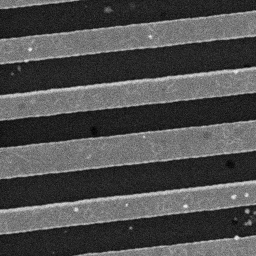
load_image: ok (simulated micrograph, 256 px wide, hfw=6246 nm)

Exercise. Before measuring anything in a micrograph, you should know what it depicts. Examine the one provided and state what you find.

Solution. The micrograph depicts lines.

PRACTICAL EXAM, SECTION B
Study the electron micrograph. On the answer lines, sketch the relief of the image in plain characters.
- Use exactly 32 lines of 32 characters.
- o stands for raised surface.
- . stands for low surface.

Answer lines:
ooooo...........................
...............................o
......................oooooooooo
.............ooooooooooooooooooo
....oooooooooooooooooooooooooooo
ooooooooooooooooooooooo.........
ooooooooooooo...................
ooooo...........................
...............................o
......................oooooooooo
.............ooooooooooooooooooo
....oooooooooooooooooooooooooooo
ooooooooooooooooooooooo.........
oooooooooooooo..................
ooooo...........................
...........................ooooo
..................oooooooooooooo
..........oooooooooooooooooooooo
.ooooooooooooooooooooooooooooooo
oooooooooooooooooooooooooo......
ooooooooooooooooo...............
oooooooo........................
................................
.........................ooooooo
................oooooooooooooooo
.......ooooooooooooooooooooooooo
oooooooooooooooooooooooo........
ooooooooooooooo.................
oooooo..........................
................................
.......................ooooooooo
.............ooooooooooooooooooo